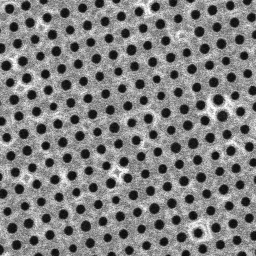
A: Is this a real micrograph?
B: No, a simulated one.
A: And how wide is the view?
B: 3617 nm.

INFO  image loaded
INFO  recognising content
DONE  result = a regular array of holes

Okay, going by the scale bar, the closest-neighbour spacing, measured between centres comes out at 242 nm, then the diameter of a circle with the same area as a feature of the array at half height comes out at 132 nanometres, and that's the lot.